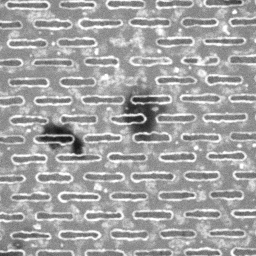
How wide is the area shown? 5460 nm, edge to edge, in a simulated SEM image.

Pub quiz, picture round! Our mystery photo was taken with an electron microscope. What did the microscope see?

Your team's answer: a regular array of holes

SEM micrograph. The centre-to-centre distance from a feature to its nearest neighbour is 645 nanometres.